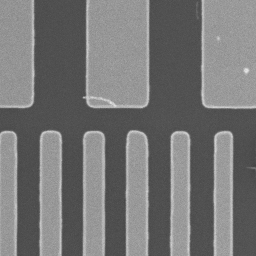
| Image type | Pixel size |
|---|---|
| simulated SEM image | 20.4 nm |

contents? wiring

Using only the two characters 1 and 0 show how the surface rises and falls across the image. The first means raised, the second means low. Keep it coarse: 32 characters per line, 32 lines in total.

11110000000111111110000001111111
11110000000111111110000001111111
11110000000111111110000001111111
11110000000111111110000001111111
11110000000111111110000001111111
11110000000111111110000001111111
11110000000111111110000001111111
11110000000111111110000001111111
11110000000111111110000001111111
11110000000111111110000001111111
11110000000111111110000001111111
11110000000111111110000001111111
11110000000111111100000001111111
00000000000000000000000000000000
00000000000000000000000000000000
00000000000000000000000000000000
00000010000000001100000000000000
11000111001110001100011100011000
11000111001110001100011100011000
11000111001110001100011100011000
11000111001110001100011100011000
11000111001110001100011100011000
11000111001110001100011100011000
11000111001110001100011100011000
11000111001110001100011100011000
11000111001110001100011100011000
11000111001110001100011100011000
11000111001110001100011100011000
11000111001110001100011100011000
11000111001110001100011100011000
11000111001110001100011100011000
11000111001110001100011100011000